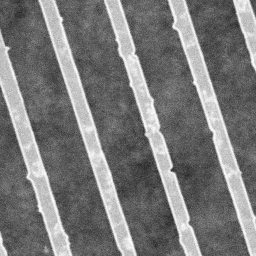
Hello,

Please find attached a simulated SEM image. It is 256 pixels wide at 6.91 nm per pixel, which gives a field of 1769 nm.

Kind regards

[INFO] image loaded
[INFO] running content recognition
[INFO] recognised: one or a few lines or trenches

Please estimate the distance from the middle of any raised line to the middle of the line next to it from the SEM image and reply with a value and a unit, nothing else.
427 nm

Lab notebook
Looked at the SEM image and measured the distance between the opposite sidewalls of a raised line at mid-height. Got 96.3 nm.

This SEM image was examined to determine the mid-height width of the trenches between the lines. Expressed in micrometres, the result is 0.334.